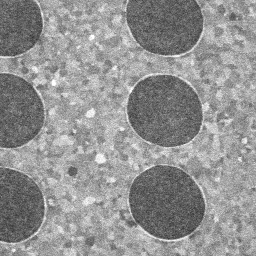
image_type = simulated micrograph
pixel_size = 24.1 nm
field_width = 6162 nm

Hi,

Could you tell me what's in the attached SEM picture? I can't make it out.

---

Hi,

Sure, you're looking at holes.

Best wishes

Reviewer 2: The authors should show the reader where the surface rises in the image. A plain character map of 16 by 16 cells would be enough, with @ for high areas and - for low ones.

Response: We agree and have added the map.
--@@@@@@----@@@@
---@@@@@-----@@@
--@@@@@@----@@@@
-@@@@@@@@@@@@@@@
@@@@@@@@@@@@@@@@
--@@@@@@----@@@@
---@@@@@-----@@@
---@@@@@-----@@@
--@@@@@@@---@@@@
@@@@@@@@@@@@@@@@
@@@@@@@@@--@@@@@
--@@@@@@----@@@@
---@@@@@-----@@@
---@@@@@-----@@@
--@@@@@@@---@@@@
@@@@@@@@@@@@@@@@